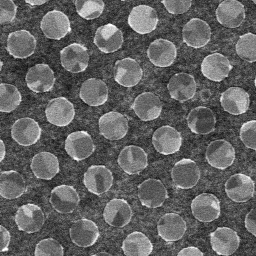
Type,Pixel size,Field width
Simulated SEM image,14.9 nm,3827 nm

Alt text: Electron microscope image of a regular array of raised bodies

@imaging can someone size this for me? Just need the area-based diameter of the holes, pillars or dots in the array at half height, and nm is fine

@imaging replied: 430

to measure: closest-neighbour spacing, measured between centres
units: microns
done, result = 0.579